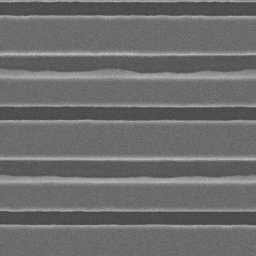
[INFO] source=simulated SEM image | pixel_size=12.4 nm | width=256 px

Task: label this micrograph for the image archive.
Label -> lines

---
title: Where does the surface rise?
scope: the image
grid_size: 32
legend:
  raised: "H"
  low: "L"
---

LLLLLLLLLLLLLLLLLLLLLLLLLLLLLLLL
LLLLLLLLLLLLLLLLLLLLLLLLLLLLLLLL
HHHHHHHHHHHHHHHHHHHHHHHHHHHHHHHH
HHHHHHHHHHHHHHHHHHHHHHHHHHHHHHHH
HHHHHHHHHHHHHHHHHHHHHHHHHHHHHHHH
HHHHHHHHHHHHHHHHHHHHHHHHHHHHHHHH
HHHHHHHHHHHHHHHHHHHHHHHHHHHHHHHH
LLLLLLLLLLLLLLLLLLLLLLLLLLLLLLLL
LLLLLLLLLLLLLLLLLLLLLLLLLLLLLLLL
HHHHHHHHHHHHHHHHHHHHHHLLHHHHHHHH
HHHHHHHHHHHHHHHHHHHHHHHHHHHHHHHH
HHHHHHHHHHHHHHHHHHHHHHHHHHHHHHHH
HHHHHHHHHHHHHHHHHHHHHHHHHHHHHHHH
LLLLLLLLLLLLLLLLLLLLLLLLLLLLLLLL
LLLLLLLLLLLLLLLLLLLLLLLLLLLLLLLL
HHHHHHHHHHHHHHHHHHHHHHHHHHHHHHHH
HHHHHHHHHHHHHHHHHHHHHHHHHHHHHHHH
HHHHHHHHHHHHHHHHHHHHHHHHHHHHHHHH
HHHHHHHHHHHHHHHHHHHHHHHHHHHHHHHH
HHHHHHHHHHHHHHHHHHHHHHHHHHHHHHHH
LLLLLLLLLLLLLLLLLLLLLLLLLLLLLLLL
LLLLLLLLLLLLLLLLLLLLLLLLLLLLLLLL
HHHHHHHHHHLLLLLLLHHLLLHHHHLHHHHH
HHHHHHHHHHHHHHHHHHHHHHHHHHHHHHHH
HHHHHHHHHHHHHHHHHHHHHHHHHHHHHHHH
HHHHHHHHHHHHHHHHHHHHHHHHHHHHHHHH
LLLLLLLLLLLLLLLLLLLLLLLLLLLLLLLL
LLLLLLLLLLLLLLLLLLLLLLLLLLLLLLLL
HHHHHHHHHHHHHHHHHHHHHHHHHHHHHHHH
HHHHHHHHHHHHHHHHHHHHHHHHHHHHHHHH
HHHHHHHHHHHHHHHHHHHHHHHHHHHHHHHH
HHHHHHHHHHHHHHHHHHHHHHHHHHHHHHHH